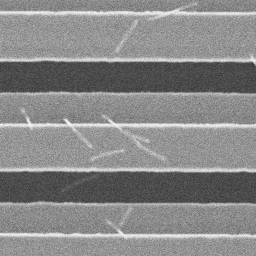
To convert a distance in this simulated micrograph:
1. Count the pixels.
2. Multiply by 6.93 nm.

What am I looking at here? lines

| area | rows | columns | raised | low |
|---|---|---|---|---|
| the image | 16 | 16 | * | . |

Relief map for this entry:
****************
****************
****************
****************
................
................
****************
****************
****************
****************
****************
................
................
****************
****************
****************